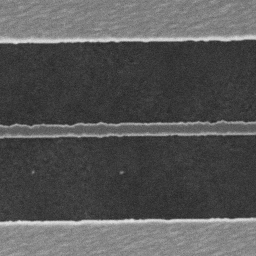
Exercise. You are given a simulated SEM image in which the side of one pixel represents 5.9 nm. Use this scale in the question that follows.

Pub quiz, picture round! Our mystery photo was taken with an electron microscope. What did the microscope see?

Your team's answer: lines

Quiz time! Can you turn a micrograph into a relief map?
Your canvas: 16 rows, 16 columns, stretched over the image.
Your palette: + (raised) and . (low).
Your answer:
++++++++++++++++
++++++++++++++++
+++++++++++++...
................
................
................
................
................
................
................
................
................
................
................
++++++++++++++++
++++++++++++++++